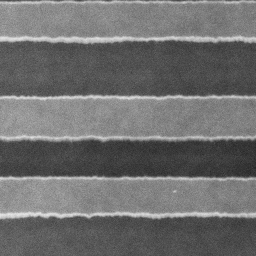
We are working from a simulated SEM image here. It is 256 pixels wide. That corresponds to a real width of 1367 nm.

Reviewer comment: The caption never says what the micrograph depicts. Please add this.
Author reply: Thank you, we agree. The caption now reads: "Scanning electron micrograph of lines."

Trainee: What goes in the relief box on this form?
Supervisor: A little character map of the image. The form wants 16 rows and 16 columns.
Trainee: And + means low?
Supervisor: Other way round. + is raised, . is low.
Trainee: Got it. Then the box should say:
++++++++++++++++
++++++++++++++++
.....+..........
................
................
................
++++++++++++++++
++++++++++++++++
++++++++++++++++
................
................
++++++++++++++++
++++++++++++++++
................
................
................